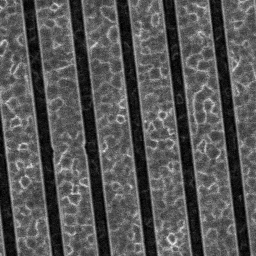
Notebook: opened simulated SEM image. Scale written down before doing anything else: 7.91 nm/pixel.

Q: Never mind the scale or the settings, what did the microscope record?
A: parallel lines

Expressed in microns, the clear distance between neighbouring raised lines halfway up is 0.101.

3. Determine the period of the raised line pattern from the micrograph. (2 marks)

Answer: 0.367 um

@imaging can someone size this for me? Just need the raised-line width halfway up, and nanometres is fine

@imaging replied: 263